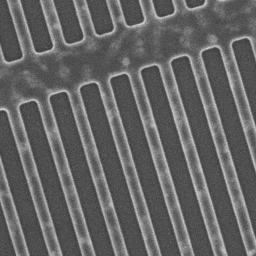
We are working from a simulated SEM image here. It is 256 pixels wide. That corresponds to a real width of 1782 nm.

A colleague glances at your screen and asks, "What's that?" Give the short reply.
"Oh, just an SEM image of parallel lines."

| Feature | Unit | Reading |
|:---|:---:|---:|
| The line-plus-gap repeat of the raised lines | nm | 221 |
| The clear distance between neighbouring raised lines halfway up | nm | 134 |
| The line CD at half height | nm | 86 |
